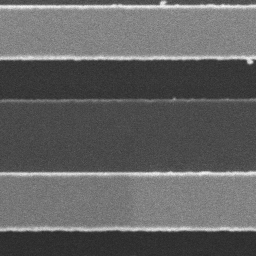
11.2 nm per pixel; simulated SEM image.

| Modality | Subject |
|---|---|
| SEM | lines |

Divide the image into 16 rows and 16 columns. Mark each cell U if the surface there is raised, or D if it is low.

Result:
UUUUUUUUUUUUUUUU
UUUUUUUUUUUUUUUU
UUUUUUUUUUUUUUUU
UUUUUUUUUUUUUUUU
DDDDDDDDDDDDDDDD
DDDDDDDDDDDDDDDD
UUUUUUUUUUUUUUUU
UUUUUUUUUUUUUUUU
UUUUUUUUUUUUUUUU
UUUUUUUUUUUUUUUU
UUUUUUUUUUUUUUUU
UUUUUUUUUUUUUUUU
UUUUUUUUUUUUUUUU
UUUUUUUUUUUUUUUU
DDDDDDDDDDDDDDDD
DDDDDDDDDDDDDDDD